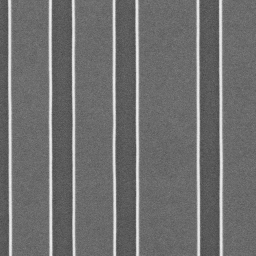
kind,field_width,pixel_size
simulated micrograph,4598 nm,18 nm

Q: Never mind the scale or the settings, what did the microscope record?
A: groups of lines, slits or small figures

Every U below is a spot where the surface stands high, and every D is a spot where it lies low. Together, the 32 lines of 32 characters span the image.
DUUUUUDDDUUUUUDDDUUUUUUUUDDDUUUU
DUUUUUDDDUUUUUDDDUUUUUUUUDDDUUUU
DUUUUUDDDUUUUUDDDUUUUUUUUDDDUUUU
DUUUUUDDDUUUUUDDDUUUUUUUUDDDUUUU
DUUUUUDDDUUUUUDDDUUUUUUUUDDDUUUU
DUUUUUDDDUUUUUDDDUUUUUUUUDDDUUUU
DUUUUUDDDUUUUUDDDUUUUUUUUDDDUUUU
DUUUUUDDDUUUUUDDDUUUUUUUUDDDUUUU
DUUUUUDDDUUUUUDDDUUUUUUUUDDDUUUU
DUUUUUDDDUUUUUDDDUUUUUUUUDDDUUUU
DUUUUUDDDUUUUUDDDUUUUUUUUDDDUUUU
DUUUUUDDDUUUUUDDDUUUUUUUUDDDUUUU
DUUUUUDDDUUUUUDDDUUUUUUUUDDDUUUU
DUUUUUDDDUUUUUDDDUUUUUUUUDDDUUUU
DUUUUUDDDUUUUUDDDUUUUUUUUDDDUUUU
DUUUUUDDDUUUUUDDDUUUUUUUUDDDUUUU
DUUUUUDDDUUUUUDDDUUUUUUUUDDDUUUU
DUUUUUDDDUUUUUDDDUUUUUUUUDDDUUUU
DUUUUUDDDUUUUUDDDUUUUUUUUDDDUUUU
DUUUUUDDDUUUUUDDDUUUUUUUUDDDUUUU
DUUUUUDDDUUUUUDDDUUUUUUUUDDDUUUU
DUUUUUDDDUUUUUDDDUUUUUUUUDDDUUUU
DUUUUUDDDUUUUUDDDUUUUUUUUDDDUUUU
DUUUUUDDDUUUUUDDDUUUUUUUUDDDUUUU
DUUUUUDDDUUUUUDDDUUUUUUUUDDDUUUU
DUUUUUDDDUUUUUDDDUUUUUUUUDDDUUUU
DUUUUUDDDUUUUUDDDUUUUUUUUDDDUUUU
DUUUUUDDDUUUUUDDDUUUUUUUUDDDUUUU
DUUUUUDDDUUUUUDDDUUUUUUUUDDDUUUU
DUUUUUDDDUUUUUDDDUUUUUUUUDDDUUUU
DUUUUUDDDUUUUUDDDUUUUUUUUDDDUUUU
DUUUUUDDDUUUUUDDDUUUUUUUUDDDUUUU